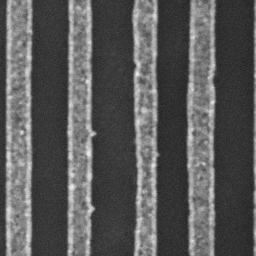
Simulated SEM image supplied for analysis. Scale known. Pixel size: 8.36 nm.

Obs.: one or a few lines or trenches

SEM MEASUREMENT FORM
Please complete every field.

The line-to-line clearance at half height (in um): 0.354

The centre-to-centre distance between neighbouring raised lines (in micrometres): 0.509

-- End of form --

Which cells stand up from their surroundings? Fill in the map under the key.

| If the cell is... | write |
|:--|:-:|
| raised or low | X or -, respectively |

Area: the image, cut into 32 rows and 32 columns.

-XXX-----XX------XX-----XXX-----
-XXX-----XX------XX-----XXX-----
-XXX-----XX------XX-----XXX-----
-XXX-----XX------XX-----XX------
-XXX-----XX------XX-----XX------
-XXX-----XX------XX-----XX------
-XXX-----XX------XX-----XX------
-XXX-----XX------XX-----XX------
-XX------XX------XX-----XX------
-XX------XX------XX-----XX------
-XX------XX------XX-----XX------
-XX------XX------XX-----XXX-----
-XX------XX------XX-----XXX-----
-XX------XX------XX-----XX------
-XX------XX------XX-----XX------
-XX------XX------XX-----XX------
-XXX-----XX------XX-----XX------
-XXX-----XX------XX-----XX------
-XXX-----XX------XX-----XX------
-XXX-----XX------XX-----XX------
-XXX-----XX-------X-----XX------
-XXX-----XX-------X-----XX------
-XXX-----XX-------X-----XX------
-XX------XX------XX-----XX------
-XXX-----XX------XX-----XX------
-XXX-----XX------XX-----XX------
-XXX-----XX------XX-----XX------
-XXX-----XX------XX-----XX------
-XXX-----XX------XX-----XX------
-XXX-----XX------XX-----XX------
-XXX-----XX------XX-----XX------
-XXX-----XX------XX-----XX------